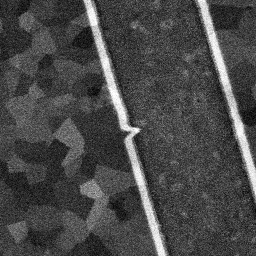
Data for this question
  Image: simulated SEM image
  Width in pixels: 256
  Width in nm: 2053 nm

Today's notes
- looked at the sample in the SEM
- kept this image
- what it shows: one or a few lines or trenches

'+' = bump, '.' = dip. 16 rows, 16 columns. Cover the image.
++++++.......+++
++++++.......+++
++++++.......+++
++++++........++
+++++++.......++
+++++++.......++
+++++++........+
++++++++.......+
++++++++.......+
++++++++.......+
+++++++++.......
+++++++++.......
+++++++++.......
+++++++++.......
++++++++++......
++++++++++......